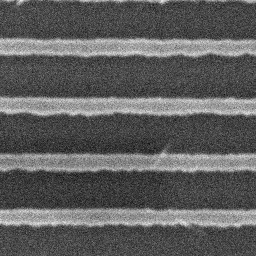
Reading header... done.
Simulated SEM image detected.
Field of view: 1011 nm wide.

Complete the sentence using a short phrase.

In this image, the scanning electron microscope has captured lines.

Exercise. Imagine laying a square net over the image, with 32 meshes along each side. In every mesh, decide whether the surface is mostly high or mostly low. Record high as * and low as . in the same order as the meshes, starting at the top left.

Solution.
................................
................................
................................
................................
................................
********************************
********************************
................................
................................
................................
................................
................................
******************************.*
********************************
................................
................................
................................
................................
................................
******************.*************
********************************
................................
................................
................................
................................
................................
********************************
********************************
................................
................................
................................
................................